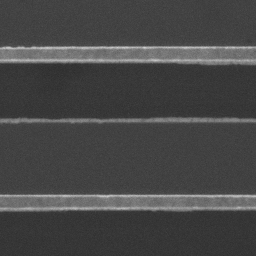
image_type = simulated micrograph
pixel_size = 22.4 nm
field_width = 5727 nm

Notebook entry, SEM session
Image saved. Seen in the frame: lines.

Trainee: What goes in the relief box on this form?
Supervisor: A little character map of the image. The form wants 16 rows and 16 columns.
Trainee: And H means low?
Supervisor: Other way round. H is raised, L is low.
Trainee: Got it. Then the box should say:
HHHHHHHHHHHHHHHH
HHHHHHHHHHHHHHHH
HHHHHHHHHHHHHHHH
HHHHHHHHHHHHHHHH
LLLLLLLLLLLLLLLL
LLLLLLLLLLLLLLLL
LLLLLLLLLLLLLLLL
LLLLLLLLLLLLLLLL
HHHHHHHHHHHHHHHH
HHHHHHHHHHHHHHHH
HHHHHHHHHHHHHHHH
HHHHHHHHHHHHHHHH
HHHHHHHHHHHHHHHH
LLLLLLLLLLLLLLLL
LLLLLLLLLLLLLLLL
LLLLLLLLLLLLLLLL